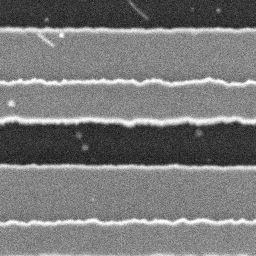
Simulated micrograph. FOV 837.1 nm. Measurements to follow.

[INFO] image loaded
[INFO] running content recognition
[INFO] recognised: lines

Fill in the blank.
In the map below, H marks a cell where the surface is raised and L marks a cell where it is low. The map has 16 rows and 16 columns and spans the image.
LLLLLLLLLLLLLLLL
LLLLLLLLLLLLLLLL
HHHHHHHHHHHHHHHH
HHHHHHHHHHHHHHHH
HHHHHHHHHHHHHHHH
HHHHHHHHHHHHHHHH
HHHHHHHHHHHHHHHH
HHHHHHHHHHHHHHLH
LLLLLLLLLLLLLLLL
LLLLLLLLLLLLLLLL
HHHHHHHHHHHHHHHH
HHHHHHHHHHHHHHHH
HHHHHHHHHHHHHHHH
HHHHHHHHHHHHHHHH
HHHHHHHHHHHHHHHH
HHHHHHHHHHHHHHHH